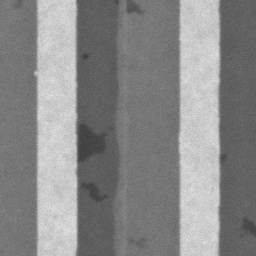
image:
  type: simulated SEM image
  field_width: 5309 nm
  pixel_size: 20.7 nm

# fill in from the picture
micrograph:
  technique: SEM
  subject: lines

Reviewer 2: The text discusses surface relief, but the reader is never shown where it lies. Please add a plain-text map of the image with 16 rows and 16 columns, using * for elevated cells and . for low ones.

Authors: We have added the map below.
*****...******..
*****...******..
*****...******..
*****...******..
*****...******..
*****...******..
*****...******..
*****...******..
*****...******..
*****...******..
*****...******..
*****...******..
*****...******..
*****...******..
*****...******..
*****...******..